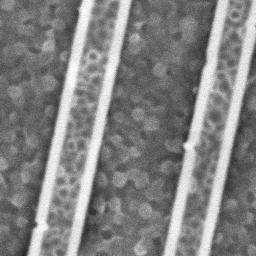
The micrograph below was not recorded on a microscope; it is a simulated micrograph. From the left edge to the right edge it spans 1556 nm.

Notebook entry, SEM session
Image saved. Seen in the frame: one or a few lines or trenches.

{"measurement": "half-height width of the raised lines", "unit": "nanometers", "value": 218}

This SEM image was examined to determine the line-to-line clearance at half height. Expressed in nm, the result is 581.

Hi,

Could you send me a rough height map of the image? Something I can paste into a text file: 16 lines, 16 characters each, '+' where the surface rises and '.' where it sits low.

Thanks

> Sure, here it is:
.....+++......++
.....+++......++
.....++......+++
.....++......++.
.....++......++.
....+++......++.
....++.......++.
....++......+++.
....++......++..
...+++......++..
...+++......++..
...++.......++..
...++......++...
...++......++...
..+++......++...
..+++......++...